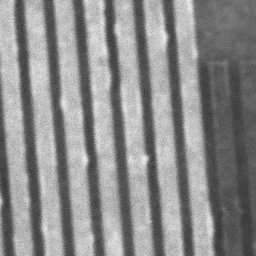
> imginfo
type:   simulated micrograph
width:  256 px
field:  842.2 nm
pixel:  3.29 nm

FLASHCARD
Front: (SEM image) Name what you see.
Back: parallel lines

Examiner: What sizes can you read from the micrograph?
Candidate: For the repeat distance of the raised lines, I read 98.1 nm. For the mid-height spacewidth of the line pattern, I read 41.4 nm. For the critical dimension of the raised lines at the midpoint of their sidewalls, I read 55.7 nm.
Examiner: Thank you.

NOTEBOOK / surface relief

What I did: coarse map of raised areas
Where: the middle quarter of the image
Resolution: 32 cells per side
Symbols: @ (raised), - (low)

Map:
@@@----@@@@---@@@@----@@@@---@@@
@@@----@@@@---@@@@----@@@@---@@@
@@@----@@@@@--@@@@----@@@@---@@@
@@@----@@@@@--@@@@----@@@@---@@@
@@@@---@@@@@---@@@@---@@@@----@@
@@@@---@@@@---@@@@@---@@@@----@@
@@@@---@@@@---@@@@@---@@@@----@@
@@@@---@@@@---@@@@@---@@@@----@@
@@@@---@@@@---@@@@@---@@@@----@@
@@@@---@@@@----@@@@---@@@@----@@
@@@@---@@@@----@@@@---@@@@----@@
@@@@----@@@@---@@@@----@@@@---@@
@@@@----@@@@---@@@@----@@@@---@@
@@@@@---@@@@---@@@@----@@@@---@@
@@@@@---@@@@---@@@@----@@@@---@@
@@@@----@@@@---@@@@----@@@@---@@
-@@@@---@@@@----@@@@---@@@@---@@
-@@@@---@@@@----@@@@---@@@@---@@
-@@@@---@@@@----@@@@---@@@@----@
-@@@@---@@@@----@@@@---@@@@----@
-@@@@---@@@@----@@@@---@@@@----@
-@@@@---@@@@----@@@@---@@@@----@
-@@@@---@@@@----@@@@---@@@@----@
-@@@@@---@@@@---@@@@@--@@@@@---@
-@@@@@---@@@@---@@@@@--@@@@@---@
-@@@@----@@@@---@@@@---@@@@@---@
-@@@@----@@@@---@@@@----@@@@---@
-@@@@----@@@@---@@@@----@@@@---@
--@@@@---@@@@----@@@@---@@@@---@
--@@@@---@@@@----@@@@---@@@@---@
--@@@@---@@@@----@@@@---@@@@---@
--@@@@---@@@@----@@@@---@@@@----